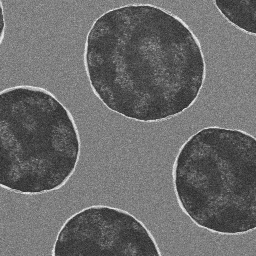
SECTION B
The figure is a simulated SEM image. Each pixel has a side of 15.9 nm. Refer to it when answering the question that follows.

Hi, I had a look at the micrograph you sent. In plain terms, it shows holes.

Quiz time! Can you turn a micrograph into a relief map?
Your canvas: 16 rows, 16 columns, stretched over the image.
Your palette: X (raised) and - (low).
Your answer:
XXXXXXXX--XXXX--
XXXXXX-----XXXX-
XXXXXX------XXXX
XXXXX--------XXX
XXXXX--------XXX
X-XXXX-------XXX
----XXX-----XXXX
----XXXXXXXXXXXX
-----XXXXXXX----
-----XXXXXX-----
-----XXXXXX-----
----XXXXXXX-----
XXXXXXXXXXX-----
XXXXX---XXXX----
XXXX-----XXXXX-X
XXX-------XXXXXX